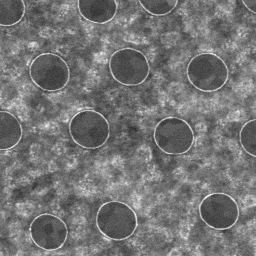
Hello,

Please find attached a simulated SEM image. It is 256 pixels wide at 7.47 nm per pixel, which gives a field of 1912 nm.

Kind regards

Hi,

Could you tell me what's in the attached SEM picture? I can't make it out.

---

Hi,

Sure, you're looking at a regular array of raised bodies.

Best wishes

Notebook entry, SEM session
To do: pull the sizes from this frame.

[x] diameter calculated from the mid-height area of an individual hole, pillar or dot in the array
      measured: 285 nanometers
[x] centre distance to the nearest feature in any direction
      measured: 528 nm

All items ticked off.